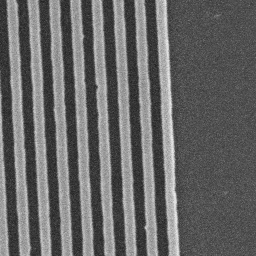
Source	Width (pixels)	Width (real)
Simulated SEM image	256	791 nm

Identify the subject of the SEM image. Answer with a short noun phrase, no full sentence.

parallel lines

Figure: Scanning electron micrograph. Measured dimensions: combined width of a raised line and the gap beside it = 65.8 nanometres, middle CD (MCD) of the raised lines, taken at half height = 29.3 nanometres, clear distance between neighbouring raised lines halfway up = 35.1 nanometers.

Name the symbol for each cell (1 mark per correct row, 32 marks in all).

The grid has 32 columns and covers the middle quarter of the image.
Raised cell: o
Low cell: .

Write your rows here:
...oo...oo...ooo...oo...oo......
...oo...oo...ooo...oo...oo......
...oo...oo...ooo...oo...oo......
...oo...oo...ooo...oo...oo......
...oo...oo....oo...oo...oo......
...oo....oo...oo...oo...oo......
...oo...ooo...oo...oo...oo......
...oo...ooo...oo...oo...oo......
...oo...oo....oo...oo....o......
...oo...oo....oo...oo....oo.....
...oo...ooo...oo...oo...ooo.....
...oo....oo...oo...oo...ooo.....
...oo....oo...oo...oo....oo.....
...ooo...oo...oo...ooo...oo.....
...ooo...oo...oo...ooo...oo.....
...ooo...oo...oo...ooo...oo.....
....oo...oo...oo....oo...oo.....
o...oo...oo...oo....oo...oo.....
o...oo...oo...oo....oo...oo.....
o...oo...oo...oo....oo...oo.....
....oo...oo....o....oo...oo.....
....oo...oo...ooo...oo...oo.....
o...oo...oo...ooo...oo...oo.....
o...oo...oo...ooo...oo...oo.....
o...oo...oo....oo...oo...oo.....
o...oo...ooo...oo...oo...oo.....
o...oo...ooo...oo...oo...oo.....
o...oo...ooo...oo...oo....o.....
o...oo...ooo...oo...oo...oo.....
o...oo...oo....oo...oo....oo....
o...oo...ooo...oo...oo....oo....
o...oo...ooo...oo...oo...oo.....